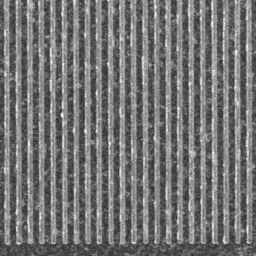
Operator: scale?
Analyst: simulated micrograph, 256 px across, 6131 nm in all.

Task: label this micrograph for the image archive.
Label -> parallel lines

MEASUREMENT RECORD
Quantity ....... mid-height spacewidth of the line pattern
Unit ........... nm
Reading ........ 77.8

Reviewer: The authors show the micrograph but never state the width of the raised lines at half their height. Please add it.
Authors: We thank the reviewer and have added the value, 198 nanometres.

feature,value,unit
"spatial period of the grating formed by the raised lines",276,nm